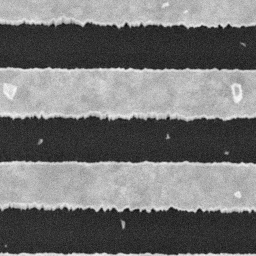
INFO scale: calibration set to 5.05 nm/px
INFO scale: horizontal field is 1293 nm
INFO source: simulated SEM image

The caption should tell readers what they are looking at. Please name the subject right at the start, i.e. lines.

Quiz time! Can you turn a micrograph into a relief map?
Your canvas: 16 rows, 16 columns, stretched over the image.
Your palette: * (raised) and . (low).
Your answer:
****************
......***.******
................
................
****************
****************
****************
................
................
................
****************
****************
****************
................
................
................